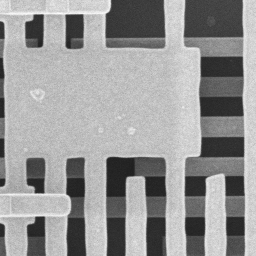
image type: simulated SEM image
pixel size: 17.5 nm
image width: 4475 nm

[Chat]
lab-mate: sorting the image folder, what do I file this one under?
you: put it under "wiring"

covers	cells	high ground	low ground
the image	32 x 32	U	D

UUUUUUUUUUUUUUDDDDDDDUUDDDDDDDUU
UUUUUUUUUUUUUDDDDDDDDUUDDDDDDDUU
UUUUDUUUDDUUUDDDDDDDDUUDDDDDDDUU
DUUDDUUUDDUUUDDDDDDDDUUDDDDDDDUU
DUUDDUUUDDUUUDDDDDDDDUUDDDDDDDUU
DUUDDUUUDDUUUDDDDDDDDUUDDDDDDDUU
UUUUUUUUUUUUUUUUUUUUUUUUUDDDDDUU
UUUUUUUUUUUUUUUUUUUUUUUUUDDDDDUU
UUUUUUUUUUUUUUUUUUUUUUUUUDDDDDUU
DUUUUUUUUUUUUUUUUUUUUUUUUDDDDDUU
DUUUUUUUUUUUUUUUUUUUUUUUUDDDDDUU
DUUUUUUUUUUUUUUUUUUUUUUUUDDDDDUU
DUUUUUUUUUUUUUUUUUUUUUUUUDDDDDUU
DUUUUUUUUUUUUUUUUUUUUUUUUDDDDDUU
DUUUUUUUUUUUUUUUUUUUUUUUUDDDDDUU
DUUUUUUUUUUUUUUUUUUUUUUUUDDDDDDU
DUUUUUUUUUUUUUUUUUUUUUUUUDDDDDDU
DUUUUUUUUUUUUUUUUUUUUUUUUDDDDDDU
DUUUUUUUUUUUUUUUUUUUUUUUUDDDDDDU
DUUUUUUUUUUUUUUUUUUUUUUUUDDDDDDU
DUUDDDUUDDDUUDDDDDDDDUUDDDDDDDDU
DUUDDDUUDDDUUDDDDDDDDUUDDDDDDDDU
DUUDDDUUDDDUUDDDUUDDDUUDDDUUDDDU
UUUUDDUUDDDUUDDDUUDDDUUDDDUUDDDU
UUUUUUUUUDDUUDDDUUDDDUUDDDUUDDDU
UUUUUUUUUDDUUDDDUUDDDUUDDDUUDDDU
UUUUUUUUUDDUUDDDUUDDDUUDDDUUDDDU
UUUUDDUUDDDUUDDDUUDDDUUDDDUUDDDU
DUUDDDUUDDDUUDDDUUDDDUUDDDUUDDDU
DUUDDDUUDDDUUDDDUUDDDUUDDDUUDDDU
DUUDDDUUDDDUUDDDUUDDDUUDDDUUDDDU
DUUDDDUUDDDUUDDDUUDDDUUDDDUUDDDU